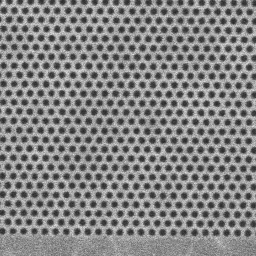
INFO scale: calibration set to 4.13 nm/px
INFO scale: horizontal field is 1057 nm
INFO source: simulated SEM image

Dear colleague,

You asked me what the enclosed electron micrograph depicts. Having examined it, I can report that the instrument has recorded a regular array of holes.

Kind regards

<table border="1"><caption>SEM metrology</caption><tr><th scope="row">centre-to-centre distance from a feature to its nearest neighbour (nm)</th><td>42.4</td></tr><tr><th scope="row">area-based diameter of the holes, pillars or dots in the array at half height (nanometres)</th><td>28.4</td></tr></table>